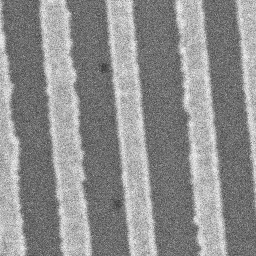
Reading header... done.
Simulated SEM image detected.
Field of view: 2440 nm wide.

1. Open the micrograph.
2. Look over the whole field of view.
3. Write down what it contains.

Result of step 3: one or a few lines or trenches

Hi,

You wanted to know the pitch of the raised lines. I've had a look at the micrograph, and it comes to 645 nm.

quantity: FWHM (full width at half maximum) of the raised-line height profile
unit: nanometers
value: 200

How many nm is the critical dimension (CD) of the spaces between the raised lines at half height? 416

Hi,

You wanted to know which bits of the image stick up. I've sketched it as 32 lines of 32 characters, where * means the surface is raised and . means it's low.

.....***......**......***.....**
.....***......**......***.....**
.....***......**......***.....**
......**......**.......**.....**
......**......***......**.....**
......***.....***......**.....**
......**......***......***.....*
......***.....***......***.....*
*.....***.....***......***.....*
*.....***.....***......***.....*
*.....***......**......***.....*
*.....***......**......***.....*
*.....***......**......***.....*
*.....***......**......***.....*
*.....****.....***......**.....*
*......***.....***......**.....*
*......***.....***......***.....
**.....***.....***......***.....
**.....***.....***......***.....
**.....***.....***......***.....
**.....***......**......***.....
**.....***......**......***.....
**.....***......**......***.....
**.....***......**......***.....
**.....***......**.......**.....
**......**......***......**.....
**......**......***......**.....
**......***.....***......***....
***.....***.....***......***....
***.....***.....***......***....
***.....***.....***......***....
***.....***......**......***....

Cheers